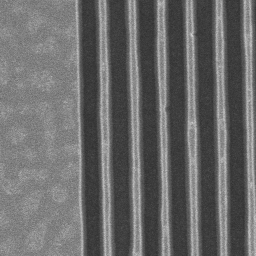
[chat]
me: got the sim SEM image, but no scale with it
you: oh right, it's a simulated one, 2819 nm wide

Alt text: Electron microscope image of parallel lines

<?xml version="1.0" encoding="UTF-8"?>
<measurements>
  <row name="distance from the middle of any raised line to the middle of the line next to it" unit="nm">319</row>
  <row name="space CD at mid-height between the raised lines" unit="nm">215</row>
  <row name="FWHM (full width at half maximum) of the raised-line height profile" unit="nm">102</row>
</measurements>